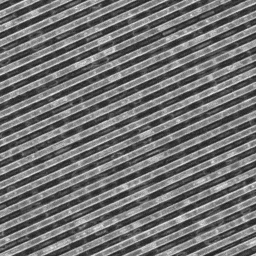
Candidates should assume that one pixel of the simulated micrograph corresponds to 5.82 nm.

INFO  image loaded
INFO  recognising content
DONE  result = parallel lines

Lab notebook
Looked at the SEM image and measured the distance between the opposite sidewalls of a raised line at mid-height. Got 35.2 nm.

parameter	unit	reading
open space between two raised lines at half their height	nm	41.2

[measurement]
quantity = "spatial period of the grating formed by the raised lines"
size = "75.8 nm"